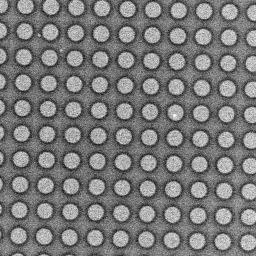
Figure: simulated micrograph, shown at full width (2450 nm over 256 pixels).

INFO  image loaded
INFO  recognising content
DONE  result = an array of small figures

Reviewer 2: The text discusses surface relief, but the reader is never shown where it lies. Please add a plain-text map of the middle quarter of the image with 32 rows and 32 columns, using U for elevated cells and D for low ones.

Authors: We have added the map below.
DDDDDDDDUUDDDDUUUDDDDUUDDDDUUUDD
DDDDDDDDDDDDDDDDDDDDDDDDDDDDDDDD
DDDDDDDDDDDDDDDDDDDDDDDDDDDDDDDD
DDUUDDDDUUDDDDDDDDDDDDDDDDDDDDDD
DUUUDDDUUUUDDDUUUDDDUUUDDDDUUDDD
DUUUDDDUUUUDDUUUUDDDUUUUDDUUUUDD
DUUUDDDDUUDDDDUUUDDDUUUDDDUUUUDD
DDDDDDDDDDDDDDDDDDDDDDDDDDDUUDDD
DDDDDDDDDDDDDDDDDDDDDDDDDDDDDDDD
DDDDDDDDDDDDDDDDDDDDDDDDDDDDDDDD
DUUUDDDUUUDDDDUUDDDDUUUDDDDUUDDD
DUUUDDDUUUUDDUUUUDDDUUUDDDUUUUDD
DUUUDDDUUUDDDUUUUDDDUUUDDDUUUUDD
DDDDDDDDDDDDDDDUDDDDUUDDDDDUUDDD
DDDDDDDDDDDDDDDDDDDDDDDDDDDDDDDD
DDDDDDDDDDDDDDDDDDDDDDDDDDDDDDDD
DUUUDDDUUUDDDDUUDDDDDDDDDDDDDDDD
UUUUDDDUUUDDDUUUUDDDUUUDDDUUUDDD
UUUUDDDUUUDDDUUUUDDDUUUDDDUUUDDD
DUUDDDDDUUDDDDUUDDDDUUUDDDUUUDDD
DDDDDDDDDDDDDDDDDDDDDDDDDDDDDDDD
DDDDDDDDDDDDDDDDDDDDDDDDDDDDDDDD
DUUDDDDDDDDDDDDDDDDDDDDDDDDDDDDD
UUUUDDDUUUDDDUUUDDDDUUDDDDUUUDDD
UUUUDDDUUUDDDUUUUDDUUUUDDDUUUDDD
DUUDDDDUUUDDDUUUDDDUUUUDDDUUUDDD
DDDDDDDDDDDDDDDDDDDDUUDDDDDUUDDD
DDDDDDDDDDDDDDDDDDDDDDDDDDDDDDDD
DDDDDDDDDDDDDDDDDDDDDDDDDDDDDDDD
UUUDDDDUUUDDDUUUDDDDUUDDDDDDDDDD
UUUUDDUUUUDDDUUUDDDUUUUDDDUUUDDD
UUUDDDUUUUDDDUUUDDDUUUUDDUUUUDDD